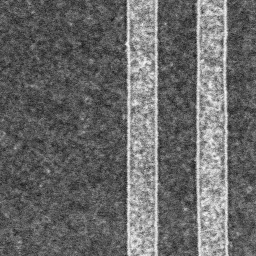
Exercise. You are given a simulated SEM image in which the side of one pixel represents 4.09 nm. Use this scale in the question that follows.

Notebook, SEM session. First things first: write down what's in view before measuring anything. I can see one or a few lines or trenches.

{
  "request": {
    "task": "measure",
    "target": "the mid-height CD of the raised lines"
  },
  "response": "115 nanometres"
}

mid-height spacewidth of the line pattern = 42 px